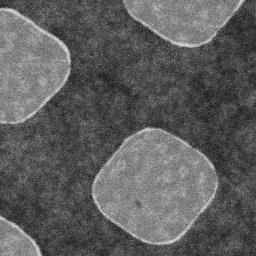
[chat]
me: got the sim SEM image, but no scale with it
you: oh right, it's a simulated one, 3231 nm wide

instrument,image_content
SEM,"raised bodies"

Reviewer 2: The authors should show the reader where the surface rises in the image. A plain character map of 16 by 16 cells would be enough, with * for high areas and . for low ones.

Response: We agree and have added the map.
........*******.
**.......*****..
****.......**...
****............
****............
****............
***.............
*...............
........***.....
.......*****....
......*******...
......********..
......*******...
.......*****....
*.......***.....
**..............